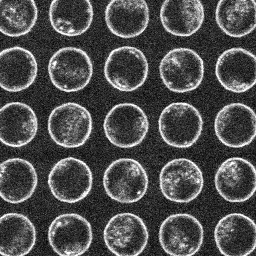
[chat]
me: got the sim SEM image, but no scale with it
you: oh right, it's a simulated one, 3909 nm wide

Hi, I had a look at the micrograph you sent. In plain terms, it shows a regular array of raised bodies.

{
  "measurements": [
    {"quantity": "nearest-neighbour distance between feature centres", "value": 838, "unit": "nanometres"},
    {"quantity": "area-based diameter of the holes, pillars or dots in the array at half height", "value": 643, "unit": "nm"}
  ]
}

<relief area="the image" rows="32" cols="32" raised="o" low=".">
oooo...oooo...oooo...oooo..ooooo
ooooo.ooooo..ooooo..ooo.o..ooooo
oooo..ooooo..ooooo..ooooo..ooooo
oooo...oooo...oooo...oooo...oooo
................................
................................
ooo....ooo....ooo....ooo....ooo.
oooo..ooooo...oooo..ooooo..ooooo
oooo..ooooo..ooooo..ooooo..ooooo
oooo..ooooo..ooooo..ooooo..ooooo
oooo...oooo...oooo...oooo...oooo
................................
................................
oooo...ooo....ooo....ooo....ooo.
oooo..ooooo...oooo..ooooo..ooooo
oooo..ooooo..ooooo..ooooo..ooooo
oooo..ooooo..ooooo..ooooo..ooooo
oooo...oooo...oooo...ooo....ooo.
................................
................................
oooo...ooo....ooo....ooo....ooo.
oooo...oooo..ooooo..ooooo..ooooo
oooo..ooooo..ooooo..ooooo..ooooo
oooo..ooooo..ooooo..ooooo..ooooo
ooo....oooo...oooo...ooo....ooo.
................................
................................
ooo....ooo....ooo....ooo....ooo.
oooo..ooooo..ooooo..ooooo..ooooo
oooo..ooooo..ooooo..ooooo..ooooo
oooo..ooooo..ooooo..ooooo..ooooo
ooo....ooo....ooo....ooo....ooo.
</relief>